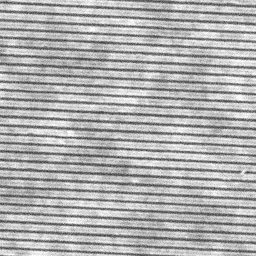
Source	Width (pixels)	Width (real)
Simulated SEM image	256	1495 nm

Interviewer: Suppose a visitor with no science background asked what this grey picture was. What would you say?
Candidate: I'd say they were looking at parallel lines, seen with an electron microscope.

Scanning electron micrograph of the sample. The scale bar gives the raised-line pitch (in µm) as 0.0511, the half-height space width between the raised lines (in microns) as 0.0204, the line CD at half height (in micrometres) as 0.0313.